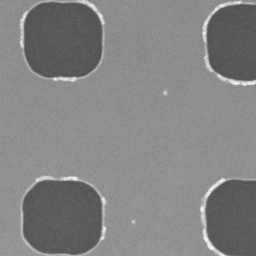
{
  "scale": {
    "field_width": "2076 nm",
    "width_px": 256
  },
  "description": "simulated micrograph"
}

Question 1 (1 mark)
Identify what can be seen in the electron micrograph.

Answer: holes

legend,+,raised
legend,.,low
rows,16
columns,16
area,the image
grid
++....++++++++..
++....+++++++...
+.....+++++++...
++....+++++++...
++....++++++++..
++++++++++++++++
++++++++++++++++
++++++++++++++++
++++++++++++++++
++++++++++++++++
++++++++++++++++
++...+++++++++..
+.....+++++++...
+.....+++++++...
+.....+++++++...
++....++++++++..